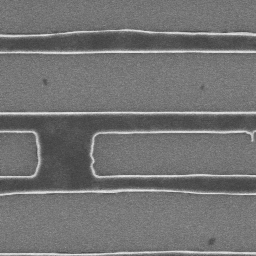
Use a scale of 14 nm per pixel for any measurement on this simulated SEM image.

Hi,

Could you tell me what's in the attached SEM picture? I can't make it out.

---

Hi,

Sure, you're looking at one or a few lines or trenches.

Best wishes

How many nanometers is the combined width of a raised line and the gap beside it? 990